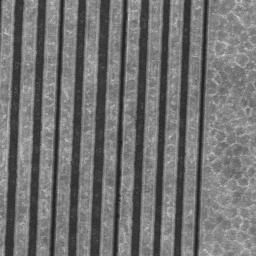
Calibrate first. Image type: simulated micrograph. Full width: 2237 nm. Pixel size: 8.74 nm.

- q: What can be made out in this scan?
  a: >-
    parallel lines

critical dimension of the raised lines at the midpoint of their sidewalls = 99.3 nm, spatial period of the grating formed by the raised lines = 183 nanometers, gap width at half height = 0.0829 micrometres